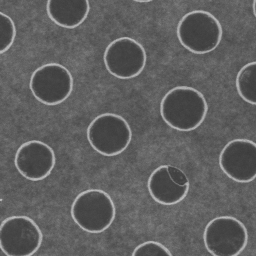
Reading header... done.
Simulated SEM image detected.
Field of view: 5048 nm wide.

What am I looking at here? a regular array of raised bodies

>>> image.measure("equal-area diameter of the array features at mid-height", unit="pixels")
40.5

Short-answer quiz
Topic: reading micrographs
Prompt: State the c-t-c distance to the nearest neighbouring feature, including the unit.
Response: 1520 nm